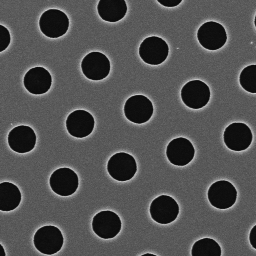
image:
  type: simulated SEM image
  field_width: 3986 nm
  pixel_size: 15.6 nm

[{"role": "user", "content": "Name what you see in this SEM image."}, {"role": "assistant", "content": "a regular array of holes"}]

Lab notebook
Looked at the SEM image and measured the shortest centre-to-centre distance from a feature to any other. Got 930 nanometres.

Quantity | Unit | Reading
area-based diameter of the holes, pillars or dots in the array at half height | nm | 449